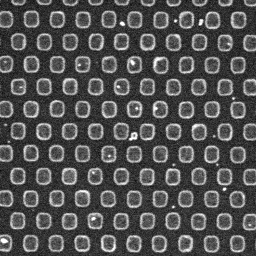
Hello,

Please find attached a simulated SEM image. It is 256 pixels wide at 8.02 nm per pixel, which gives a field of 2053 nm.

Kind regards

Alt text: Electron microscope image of a regular array of raised bodies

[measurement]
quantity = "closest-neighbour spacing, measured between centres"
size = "0.204 um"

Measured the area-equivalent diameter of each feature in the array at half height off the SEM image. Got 128 nm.